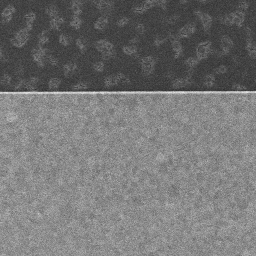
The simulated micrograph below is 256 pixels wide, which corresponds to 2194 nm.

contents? one or a few lines or trenches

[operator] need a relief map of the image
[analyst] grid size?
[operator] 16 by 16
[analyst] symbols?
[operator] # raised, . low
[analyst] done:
................
................
................
................
................
................
################
################
################
################
################
################
################
################
################
################